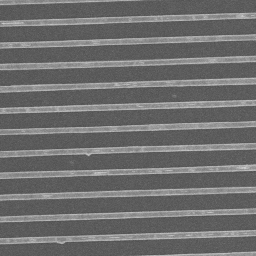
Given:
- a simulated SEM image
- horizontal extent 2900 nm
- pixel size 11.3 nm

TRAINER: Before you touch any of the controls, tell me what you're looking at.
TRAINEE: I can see parallel lines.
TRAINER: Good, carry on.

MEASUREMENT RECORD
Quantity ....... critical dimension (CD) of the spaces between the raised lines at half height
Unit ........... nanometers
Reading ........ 187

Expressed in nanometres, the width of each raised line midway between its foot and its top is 62.3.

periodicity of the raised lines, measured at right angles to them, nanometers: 246